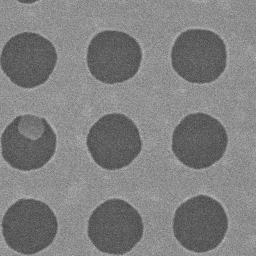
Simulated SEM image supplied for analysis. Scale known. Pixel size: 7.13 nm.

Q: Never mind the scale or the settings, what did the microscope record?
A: holes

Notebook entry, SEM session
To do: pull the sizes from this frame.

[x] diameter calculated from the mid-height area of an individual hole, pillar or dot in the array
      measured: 399 nanometres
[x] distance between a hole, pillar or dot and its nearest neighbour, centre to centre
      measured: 604 nanometers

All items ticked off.